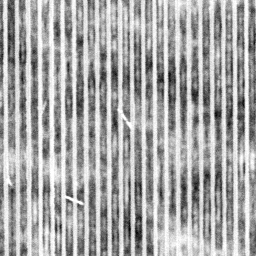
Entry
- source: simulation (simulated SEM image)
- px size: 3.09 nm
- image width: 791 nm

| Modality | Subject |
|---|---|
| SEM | parallel lines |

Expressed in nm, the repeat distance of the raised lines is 35.5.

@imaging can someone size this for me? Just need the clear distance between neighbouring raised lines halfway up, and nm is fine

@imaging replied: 26.3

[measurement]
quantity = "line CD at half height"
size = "0.0089 µm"